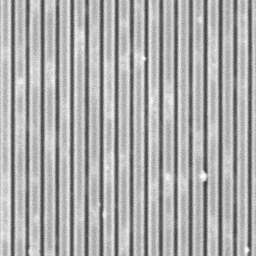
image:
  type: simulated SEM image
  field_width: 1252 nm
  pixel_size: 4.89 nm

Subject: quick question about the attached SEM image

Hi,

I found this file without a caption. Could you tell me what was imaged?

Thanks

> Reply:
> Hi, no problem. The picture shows parallel lines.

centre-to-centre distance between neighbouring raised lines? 72.5 nanometres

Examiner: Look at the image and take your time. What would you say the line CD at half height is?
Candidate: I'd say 0.0483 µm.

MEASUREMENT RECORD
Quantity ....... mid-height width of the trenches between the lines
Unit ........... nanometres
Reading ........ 26.3